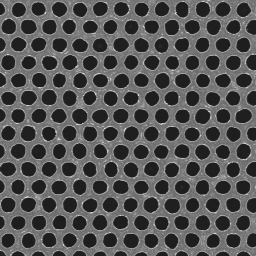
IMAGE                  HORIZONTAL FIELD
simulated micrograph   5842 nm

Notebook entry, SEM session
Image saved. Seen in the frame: a regular array of holes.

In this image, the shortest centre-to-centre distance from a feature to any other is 455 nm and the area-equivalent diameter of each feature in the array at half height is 328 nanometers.